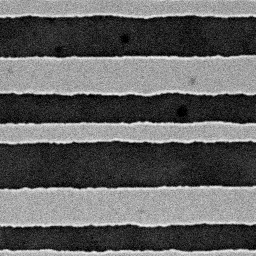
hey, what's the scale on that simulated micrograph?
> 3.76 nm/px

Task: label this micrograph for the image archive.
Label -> lines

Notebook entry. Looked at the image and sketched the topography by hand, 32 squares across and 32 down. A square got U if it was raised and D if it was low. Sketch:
UUUUUUUUUUUUUUUUUUUUUUUUUUUUUUUU
UUUUUUUUUUUUUUUUUUUUUUUUUUUUUUUU
DDDDDDDDDDDDDDDDDDDDDDDDDDDDDDDD
DDDDDDDDDDDDDDDDDDDDDDDDDDDDDDDD
DDDDDDDDDDDDDDDDDDDDDDDDDDDDDDDD
DDDDDDDDDDDDDDDDDDDDDDDDDDDDDDDD
DDDDDDDDDDDDDDDDDDDDDDDDDDDDDDDD
UUUUUUUUUUUUUUUUUUUUUUUUUUUUUUUU
UUUUUUUUUUUUUUUUUUUDDDUUUUUUUUUU
UUUUUUUUUUUUUUDUUUDDDDDUUUUUUUUU
UUUUUUUUUUUUUUUUUUUUDDDUUUUUUUUU
UUUUUUUUUUUUUUUUUUUUUUUUUUUUUUUU
DDDDDDDDDDDDDDDDDDDDDDDDDDDDDDDD
DDDDDDDDDDDDDDDDDDDDDDDDDDDDDDDD
DDDDDDDDDDDDDDDDDDDDDDDDDDDDDDDD
DUUUUUUUUUUUUUUUUUUUUUUUUUUUUUDU
UUUUUUUUUUUUUUUUUUUUUUUUUUUUUUUU
UUUUUUUUUUUUUUUUUUUUUUUUUUUUUUUU
DDDDDDDDDDDDDDDDDDDDDDDDDDDDDDDD
DDDDDDDDDDDDDDDDDDDDDDDDDDDDDDDD
DDDDDDDDDDDDDDDDDDDDDDDDDDDDDDDD
DDDDDDDDDDDDDDDDDDDDDDDDDDDDDDDD
DDDDDDDDDDDDDDDDDDDDDDDDDDDDDDDD
DDDDDDDDDDDDDDDDDDDDUUUUUUUUUUUU
UUUUUUUUUUUUUUUUUUUUUUUUUUUUUUUU
UUUUUUUUUUUUUUUUUUUUUUUUUUUUUUUU
UUUUUUUUUUUUUUUUUUUUUUUUUUUUUUUU
UUUUUUUUUUUUUUUUUUUUUUUUUUUUUUUU
DDDDDDDDDDDDDDDDDDDDDDDDDDDDDDDD
DDDDDDDDDDDDDDDDDDDDDDDDDDDDDDDD
DDDDDDDDDDDDDDDDDDDDDDDDDDDDDDDD
UUUUUUUUUUUUDUUUUUUUUUUUUUUUUUUU